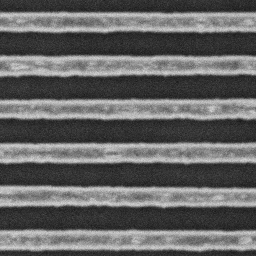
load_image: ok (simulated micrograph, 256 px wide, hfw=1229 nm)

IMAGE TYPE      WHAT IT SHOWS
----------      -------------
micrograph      lines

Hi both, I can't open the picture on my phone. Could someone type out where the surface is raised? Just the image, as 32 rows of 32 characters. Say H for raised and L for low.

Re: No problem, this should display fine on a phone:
LLLLLLLLLLLLLLLLLLLLLLLLLLLLLLLL
LLLLLLLLLLLLLLLLLLLLLLLLLLLLLLLL
HHHHHHHHHHHHHHHHHHHHHHHHHHHHHHHH
HHHHHHHHHHHHHHHHHHHHHHHHHHHHHHHH
LLLLLLLLLLLLLLLLLLLLLLLLLLLLLLLL
LLLLLLLLLLLLLLLLLLLLLLLLLLLLLLLL
LLLLLLLLLLLLLLLLLLLLLLLLLLLLLLLL
HHHHHHHHHHHHHHHHHHHHHHHHHHHHHHHH
HHHHHHHHHHHHHHHHHHHHHHHHHHHHHHHH
LLLLLLLLLLLLLLLLLLLLLLLLLLLLLLLL
LLLLLLLLLLLLLLLLLLLLLLLLLLLLLLLL
LLLLLLLLLLLLLLLLLLLLLLLLLLLLLLLL
LLLLLLLLLLLLLLLLLLLLLLLLLLLLLLLL
HHHHHHHHHHHHHHHHHHHHHHHHHHHHHHHH
HHHHHHHHHHHHHHHHHHHHHHHHHHHHHHHH
LLLLLLLLLLLLLLLLLLLLLLLLLLLLLLLL
LLLLLLLLLLLLLLLLLLLLLLLLLLLLLLLL
LLLLLLLLLLLLLLLLLLLLLLLLLLLLLLLL
HHHHHHHHHHHHHHHHHHHHHHHHHHHHHHHH
HHHHHHHHHHHHHHHHHHHHHHHHHHHHHHHH
LLLLLLLLLLLLLLLLLLLLLLLLLLLLLLLL
LLLLLLLLLLLLLLLLLLLLLLLLLLLLLLLL
LLLLLLLLLLLLLLLLLLLLLLLLLLLLLLLL
HHHHHHHHHHHHHHHHHHHHHHHLLLLLLLLL
HHHHHHHHHHHHHHHHHHHHHHHHHHHHHHHH
HHHHHHHHHHHHHHHHHHHHHHHHHHHHHHHH
LLLLLLLLLLLLLLLLLLLLLLLLLLLLLLLL
LLLLLLLLLLLLLLLLLLLLLLLLLLLLLLLL
LLLLLLLLLLLLLLLLLLLLLLLLLLLLLLLL
HHHHHHHHHHHHHHHHHHHHHHHHHHHHHHHH
HHHHHHHHHHHHHHHHHHHHHHHHHHHHHHHH
LLLLLLLLLLLLLLLLLLLLLLLLLLLLLLLL